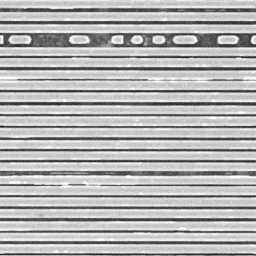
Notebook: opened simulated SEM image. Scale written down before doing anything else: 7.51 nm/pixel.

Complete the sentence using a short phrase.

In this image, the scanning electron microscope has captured parallel lines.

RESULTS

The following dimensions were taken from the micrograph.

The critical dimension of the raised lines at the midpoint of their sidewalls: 60.1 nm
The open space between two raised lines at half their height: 22.5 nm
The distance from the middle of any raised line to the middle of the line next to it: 87.2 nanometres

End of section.